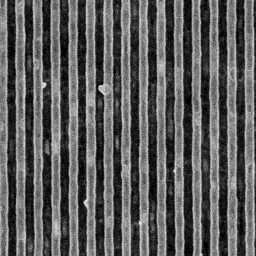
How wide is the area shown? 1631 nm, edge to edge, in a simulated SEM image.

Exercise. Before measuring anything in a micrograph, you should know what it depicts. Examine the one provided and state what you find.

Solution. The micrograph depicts parallel lines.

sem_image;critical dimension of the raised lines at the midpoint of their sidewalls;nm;53.3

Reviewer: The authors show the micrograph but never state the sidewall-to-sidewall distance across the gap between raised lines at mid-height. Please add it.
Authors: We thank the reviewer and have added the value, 58.9 nm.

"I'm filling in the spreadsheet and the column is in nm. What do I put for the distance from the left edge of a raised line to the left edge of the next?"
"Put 112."